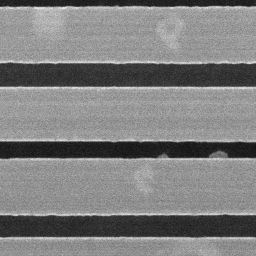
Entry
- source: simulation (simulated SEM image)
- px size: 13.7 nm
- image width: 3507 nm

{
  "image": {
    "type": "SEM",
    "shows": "lines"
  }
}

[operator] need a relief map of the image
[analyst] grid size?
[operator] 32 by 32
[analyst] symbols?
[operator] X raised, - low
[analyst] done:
--------------------------------
XXXXXXXXXXXXXXXXXXXXXXXXXXXXXXXX
XXXXXXXXXXXXXXXXXXXXXXXXXXXXXXXX
XXXXXXXXXXXXXXXXXXXXXXXXXXXXXXXX
XXXXXXXXXXXXXXXXXXXXXXXXXXXXXXXX
XXXXXXXXXXXXXXXXXXXXXXXXXXXXXXXX
XXXXXXXXXXXXXXXXXXXXXXXXXXXXXXXX
XXXXXXXXXXXXXXXXXXXXXXXXXXXXXXXX
--------------------------------
--------------------------------
--------------------------------
XXXXXXXXXXXXXXXXXXXXXXXXXXXXXXXX
XXXXXXXXXXXXXXXXXXXXXXXXXXXXXXXX
XXXXXXXXXXXXXXXXXXXXXXXXXXXXXXXX
XXXXXXXXXXXXXXXXXXXXXXXXXXXXXXXX
XXXXXXXXXXXXXXXXXXXXXXXXXXXXXXXX
XXXXXXXXXXXXXXXXXXXXXXXXXXXXXXXX
XXXXXXXXXXXXXXXXXXXXXXXXXXXXXXXX
--------------------------------
--------------------------------
XXXXXXXXXXXXXXXXXXXXXXXXXXXXXXXX
XXXXXXXXXXXXXXXXXXXXXXXXXXXXXXXX
XXXXXXXXXXXXXXXXXXXXXXXXXXXXXXXX
XXXXXXXXXXXXXXXXXXXXXXXXXXXXXXXX
XXXXXXXXXXXXXXXXXXXXXXXXXXXXXXXX
XXXXXXXXXXXXXXXXXXXXXXXXXXXXXXXX
XXXXXXXXXXXXXXXXXXXXXXXXXXXXXXXX
--------------------------------
--------------------------------
--------------------------------
XXXXXXXXXXXXXXXXXXXXXXXXXXXXXXXX
XXXXXXXXXXXXXXXXXXXXXXXXXXXXXXXX